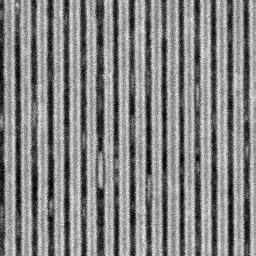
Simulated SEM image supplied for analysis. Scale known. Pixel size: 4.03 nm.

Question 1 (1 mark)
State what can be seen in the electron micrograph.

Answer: parallel lines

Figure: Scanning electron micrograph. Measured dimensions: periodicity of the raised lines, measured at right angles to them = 0.0659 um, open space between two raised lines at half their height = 8.14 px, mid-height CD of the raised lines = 32.8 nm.